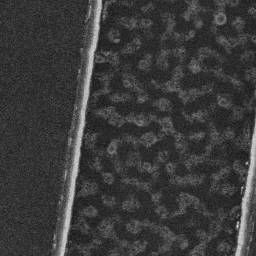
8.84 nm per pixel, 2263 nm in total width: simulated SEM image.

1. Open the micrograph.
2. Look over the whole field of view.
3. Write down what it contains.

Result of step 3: one or a few lines or trenches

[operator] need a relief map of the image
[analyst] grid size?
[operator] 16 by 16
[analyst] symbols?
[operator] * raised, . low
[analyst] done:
******..........
******..........
******..........
******..........
******..........
*****...........
*****...........
*****...........
*****...........
*****...........
*****...........
*****...........
****...........*
****...........*
****...........*
****...........*